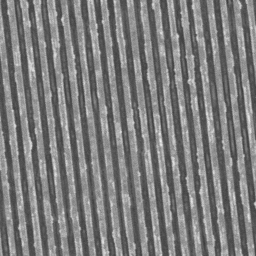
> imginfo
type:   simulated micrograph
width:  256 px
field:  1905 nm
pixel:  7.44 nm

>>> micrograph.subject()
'parallel lines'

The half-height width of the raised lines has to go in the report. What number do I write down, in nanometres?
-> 45.2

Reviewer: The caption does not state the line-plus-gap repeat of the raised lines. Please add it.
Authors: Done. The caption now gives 98 nanometres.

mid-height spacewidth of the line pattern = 50.8 nm